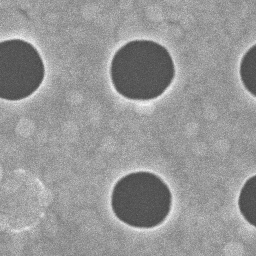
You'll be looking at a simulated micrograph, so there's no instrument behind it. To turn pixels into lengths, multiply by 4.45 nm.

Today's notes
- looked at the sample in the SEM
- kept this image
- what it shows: holes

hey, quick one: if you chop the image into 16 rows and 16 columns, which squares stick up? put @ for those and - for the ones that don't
@@@@@@@@@@@@@@@@
@@@@@@@@@@@@@@@@
-@@@@@@@@@@@@@@@
---@@@@----@@@@-
---@@@@----@@@@-
--@@@@@---@@@@@-
@@@@@@@@@@@@@@@@
@@@@@@@@@@@@@@@@
@@@@@@@@@@@@@@@@
@@@@@@@@@@@@@@@@
@@@@@@@@@@@@@@@@
@@@@@@@---@@@@@-
@@@@@@@----@@@@-
@@@@@@@---@@@@@-
@@@@@@@@@@@@@@@@
@@@@@@@@@@@@@@@@